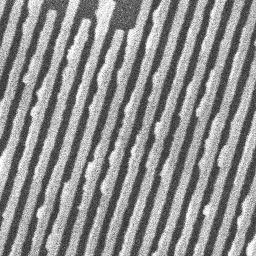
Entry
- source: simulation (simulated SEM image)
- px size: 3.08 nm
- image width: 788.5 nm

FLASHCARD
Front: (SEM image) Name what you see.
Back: parallel lines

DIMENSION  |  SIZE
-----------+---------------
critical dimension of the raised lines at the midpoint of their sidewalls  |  28.7 nm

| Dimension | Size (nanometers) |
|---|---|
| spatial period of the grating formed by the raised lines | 53.8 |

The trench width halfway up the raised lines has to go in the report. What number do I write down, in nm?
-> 23.5